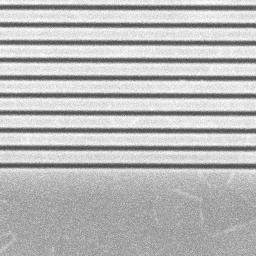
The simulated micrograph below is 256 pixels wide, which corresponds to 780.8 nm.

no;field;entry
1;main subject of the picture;parallel lines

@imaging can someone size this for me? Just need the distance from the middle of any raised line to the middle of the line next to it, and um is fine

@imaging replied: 0.0536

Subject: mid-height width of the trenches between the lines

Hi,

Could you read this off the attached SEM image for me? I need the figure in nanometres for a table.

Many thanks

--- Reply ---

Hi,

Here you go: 15.3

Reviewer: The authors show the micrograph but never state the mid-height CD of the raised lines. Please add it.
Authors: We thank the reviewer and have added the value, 38.1 nm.